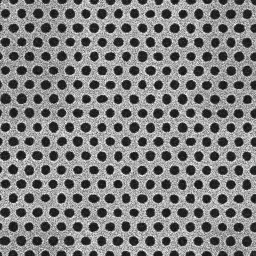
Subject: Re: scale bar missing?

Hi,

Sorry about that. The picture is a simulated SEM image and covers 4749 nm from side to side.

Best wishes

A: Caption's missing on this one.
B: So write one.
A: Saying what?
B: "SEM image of a regular array of holes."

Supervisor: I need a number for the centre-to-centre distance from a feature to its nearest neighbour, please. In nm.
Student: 293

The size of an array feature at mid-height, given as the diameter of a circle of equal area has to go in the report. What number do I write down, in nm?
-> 184